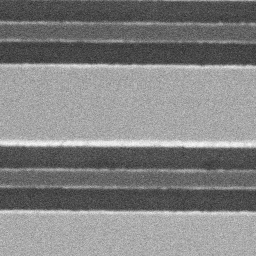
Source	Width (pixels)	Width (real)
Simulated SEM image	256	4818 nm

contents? lines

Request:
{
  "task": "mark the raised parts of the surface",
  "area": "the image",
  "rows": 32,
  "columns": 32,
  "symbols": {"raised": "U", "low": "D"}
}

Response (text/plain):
DDDDDDDDDDDDDDDDDDDDDDDDDDDDDDDD
DDDDDDDDDDDDDDDDDDDDDDDDDDDDDDDD
DDDDDDDDDDDDDDDDDDDDDDDDDDDDDDDD
UUUUUUUUUUUUUUUUUUUUUUUUUUUUUUUU
UUUUUUUUUUUUUUUUUUUUUUUUUUUUUUUU
DDDDDDDDDDDDDDDDDDDDDDDDDDDDDDDD
DDDDDDDDDDDDDDDDDDDDDDDDDDDDDDDD
DDDDDDDDDDDDDDDDDDDDDDDDDDDDDDDD
UUUUUUUUUUUUUUUUUUUUUUUUUUUUUUUU
UUUUUUUUUUUUUUUUUUUUUUUUUUUUUUUU
UUUUUUUUUUUUUUUUUUUUUUUUUUUUUUUU
UUUUUUUUUUUUUUUUUUUUUUUUUUUUUUUU
UUUUUUUUUUUUUUUUUUUUUUUUUUUUUUUU
UUUUUUUUUUUUUUUUUUUUUUUUUUUUUUUU
UUUUUUUUUUUUUUUUUUUUUUUUUUUUUUUU
UUUUUUUUUUUUUUUUUUUUUUUUUUUUUUUU
UUUUUUUUUUUUUUUUUUUUUUUUUUUUUUUU
UUUUUUUUUUUUUUUUUUUUUUUUUUUUUUUU
DDDDDDDDDDDDDDDDDDDDDDDDDDDDDDDD
DDDDDDDDDDDDDDDDDDDDDDDDDDDDDDDD
DDDDDDDDDDDDDDDDDDDDDDDDDDDDDDDD
UUUUUUUUUUUUUUUUUUUUUUUUUUUUUUUU
UUUUUUUUUUUUUUUUUUUUUUUUUUUUUUUU
DDDDDDDDDDDDDDDDDDDDUDDUUUUUUUUU
DDDDDDDDDDDDDDDDDDDDDDDDDDDDDDDD
DDDDDDDDDDDDDDDDDDDDDDDDDDDDDDDD
UUUUUUUUUUUUUUUUUUUUUDUUUDDDDDUD
UUUUUUUUUUUUUUUUUUUUUUUUUUUUUUUU
UUUUUUUUUUUUUUUUUUUUUUUUUUUUUUUU
UUUUUUUUUUUUUUUUUUUUUUUUUUUUUUUU
UUUUUUUUUUUUUUUUUUUUUUUUUUUUUUUU
UUUUUUUUUUUUUUUUUUUUUUUUUUUUUUUU